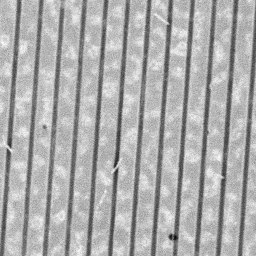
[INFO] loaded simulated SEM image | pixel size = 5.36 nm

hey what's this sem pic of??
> parallel lines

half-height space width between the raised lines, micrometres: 0.0274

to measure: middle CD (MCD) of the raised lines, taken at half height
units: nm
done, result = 88.2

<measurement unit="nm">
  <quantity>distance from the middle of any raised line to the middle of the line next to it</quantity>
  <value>116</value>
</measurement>